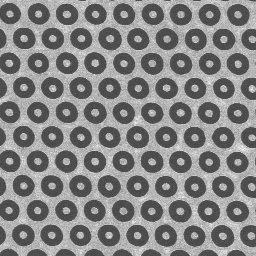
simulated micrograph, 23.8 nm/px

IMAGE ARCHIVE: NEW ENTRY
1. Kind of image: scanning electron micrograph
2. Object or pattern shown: a regular array of ring-shaped grooves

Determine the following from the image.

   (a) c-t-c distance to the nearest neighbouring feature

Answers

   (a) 28.2 px